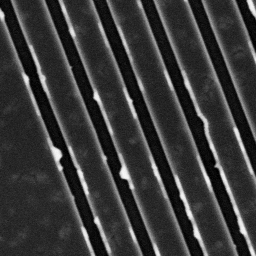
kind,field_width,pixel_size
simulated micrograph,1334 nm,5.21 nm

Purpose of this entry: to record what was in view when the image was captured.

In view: parallel lines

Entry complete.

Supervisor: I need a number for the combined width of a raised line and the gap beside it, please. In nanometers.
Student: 232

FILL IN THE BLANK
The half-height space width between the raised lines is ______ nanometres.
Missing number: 66.9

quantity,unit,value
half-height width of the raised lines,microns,0.165